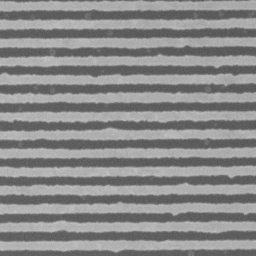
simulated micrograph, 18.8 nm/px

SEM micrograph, parallel lines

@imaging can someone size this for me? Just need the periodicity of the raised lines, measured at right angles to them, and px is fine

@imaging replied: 18.4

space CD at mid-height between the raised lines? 191 nm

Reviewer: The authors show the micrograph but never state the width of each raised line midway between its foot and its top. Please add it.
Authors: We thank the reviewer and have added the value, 153 nanometers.